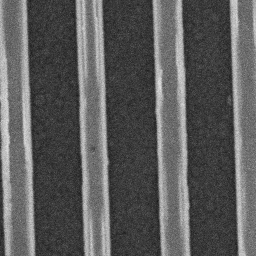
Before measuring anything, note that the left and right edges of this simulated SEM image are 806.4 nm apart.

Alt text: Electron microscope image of one or a few lines or trenches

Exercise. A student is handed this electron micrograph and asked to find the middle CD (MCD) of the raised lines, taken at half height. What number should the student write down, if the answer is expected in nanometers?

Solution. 80.6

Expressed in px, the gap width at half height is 52.8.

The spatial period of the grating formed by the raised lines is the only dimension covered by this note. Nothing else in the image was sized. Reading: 244 nm